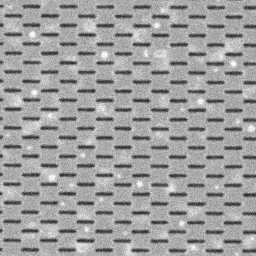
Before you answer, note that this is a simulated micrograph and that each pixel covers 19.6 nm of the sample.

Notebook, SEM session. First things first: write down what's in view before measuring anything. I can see a regular array of holes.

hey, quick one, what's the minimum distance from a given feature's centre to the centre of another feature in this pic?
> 364 nm